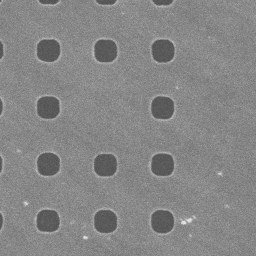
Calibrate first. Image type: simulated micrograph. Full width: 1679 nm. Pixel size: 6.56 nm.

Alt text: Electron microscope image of a regular array of holes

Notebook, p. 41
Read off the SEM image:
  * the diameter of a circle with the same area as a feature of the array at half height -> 159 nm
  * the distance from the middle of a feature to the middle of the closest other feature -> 372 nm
